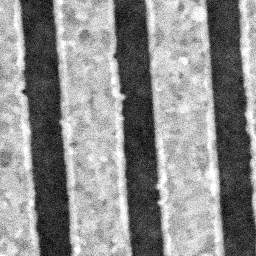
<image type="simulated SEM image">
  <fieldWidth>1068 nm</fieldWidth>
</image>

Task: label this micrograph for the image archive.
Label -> one or a few lines or trenches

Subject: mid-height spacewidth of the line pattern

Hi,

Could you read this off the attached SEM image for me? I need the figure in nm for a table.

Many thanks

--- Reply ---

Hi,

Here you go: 155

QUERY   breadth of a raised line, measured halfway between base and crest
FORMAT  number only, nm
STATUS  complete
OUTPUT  231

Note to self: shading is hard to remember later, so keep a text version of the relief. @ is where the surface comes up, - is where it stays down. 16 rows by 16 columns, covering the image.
@---@@@--@@@@--@
@---@@@--@@@@--@
@---@@@--@@@@--@
@---@@@---@@@--@
@---@@@---@@@--@
@---@@@---@@@--@
@@--@@@@--@@@---
@@--@@@@--@@@---
@@--@@@@--@@@---
@@--@@@@--@@@---
@@--@@@@--@@@---
@@--@@@@--@@@@--
@@--@@@@--@@@@--
@@---@@@--@@@@--
@@---@@@--@@@@--
@@---@@@--@@@@--